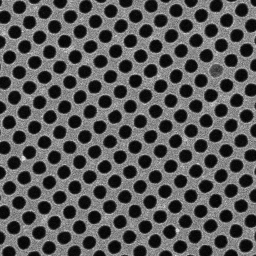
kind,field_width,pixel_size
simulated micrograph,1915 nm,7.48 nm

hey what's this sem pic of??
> a regular array of holes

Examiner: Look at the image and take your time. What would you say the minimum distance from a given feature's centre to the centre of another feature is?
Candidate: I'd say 17.8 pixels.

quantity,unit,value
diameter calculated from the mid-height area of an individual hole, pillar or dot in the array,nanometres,97